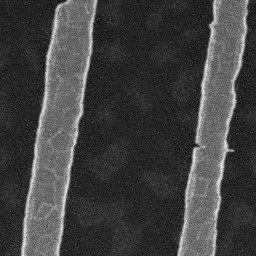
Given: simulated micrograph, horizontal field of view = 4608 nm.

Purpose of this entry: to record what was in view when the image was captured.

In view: one or a few lines or trenches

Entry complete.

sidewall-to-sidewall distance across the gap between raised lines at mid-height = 2170 nm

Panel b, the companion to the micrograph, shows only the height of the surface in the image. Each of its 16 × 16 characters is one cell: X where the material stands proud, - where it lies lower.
----XX-------XX-
---XXX-------XX-
---XXX-------XX-
---XXX-------XX-
---XX--------XX-
---XX--------XX-
---XX--------XX-
---XX-------XX--
--XXX-------XX--
--XX--------XX--
--XX--------XX--
--XX--------XX--
--XX--------XX--
--XX--------X---
--XX-------XX---
-XXX-------XX---